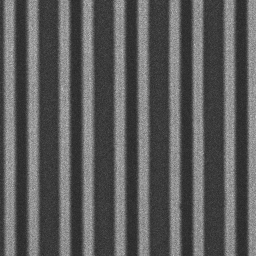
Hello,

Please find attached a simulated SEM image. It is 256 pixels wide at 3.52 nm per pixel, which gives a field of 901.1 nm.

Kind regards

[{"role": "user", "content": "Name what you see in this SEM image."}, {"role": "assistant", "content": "parallel lines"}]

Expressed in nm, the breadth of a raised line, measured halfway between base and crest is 38.3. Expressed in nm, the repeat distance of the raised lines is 96.8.